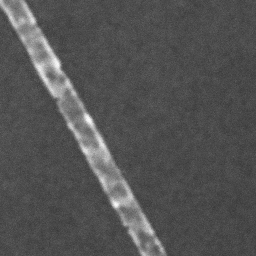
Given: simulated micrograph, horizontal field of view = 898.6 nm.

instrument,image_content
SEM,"one or a few lines or trenches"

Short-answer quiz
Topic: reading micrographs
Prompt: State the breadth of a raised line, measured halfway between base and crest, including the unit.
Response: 71.9 nanometres